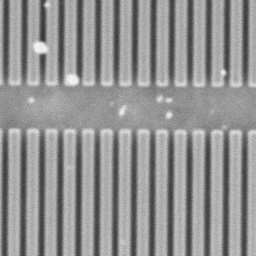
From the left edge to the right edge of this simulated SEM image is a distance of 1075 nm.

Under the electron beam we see groups of lines, slits or small figures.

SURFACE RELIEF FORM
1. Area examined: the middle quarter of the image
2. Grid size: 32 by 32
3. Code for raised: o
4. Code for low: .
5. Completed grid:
ooo..oo...oo..ooo..oo..ooo..oo..
ooo..oo...oo..ooo..oo..ooo..oo..
ooo..oo...oo..ooo..oo..ooo..oo..
oooo.oo...oo..ooo..oo..ooo..oo..
oooo.oo...oo..ooo..oo..ooo..oo..
................................
................................
................................
................................
................................
................................
................................
................................
................................
................................
................................
................................
ooo..oo..ooo..oo...oo..ooo..oo..
ooo..oo..ooo..oo...oo..ooo..oo..
ooo..oo..ooo..oo...oo..ooo..oo..
ooo..oo..ooo..oo...oo..ooo..oo..
ooo..oo..ooo..oo...oo..ooo..oo..
ooo..oo..ooo..oo...oo..ooo..oo..
ooo..oo..ooo..oo...oo..ooo..oo..
ooo..oo..ooo..oo...oo..ooo..oo..
ooo..oo..ooo..oo...oo..ooo..oo..
ooo..oo..ooo..oo...oo..ooo..oo..
ooo..oo..ooo..oo..ooo..ooo..oo..
ooo..oo..ooo..oo..ooo..ooo..oo..
ooo..oo..ooo..oo..ooo..ooo..oo..
ooo..oo..ooo..oo..ooo..ooo..oo..
ooo..oo..ooo..oo..ooo..ooo..oo..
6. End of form